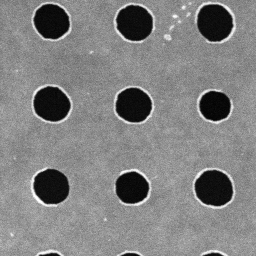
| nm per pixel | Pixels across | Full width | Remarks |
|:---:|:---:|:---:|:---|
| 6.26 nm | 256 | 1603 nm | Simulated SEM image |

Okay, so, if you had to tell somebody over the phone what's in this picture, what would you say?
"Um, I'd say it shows a regular array of holes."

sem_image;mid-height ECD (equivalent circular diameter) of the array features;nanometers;223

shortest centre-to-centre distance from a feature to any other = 510 nanometers